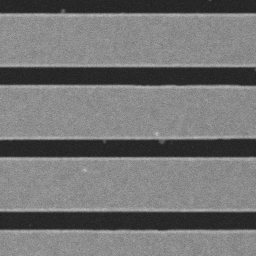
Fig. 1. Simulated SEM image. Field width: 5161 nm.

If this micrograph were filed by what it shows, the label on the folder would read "lines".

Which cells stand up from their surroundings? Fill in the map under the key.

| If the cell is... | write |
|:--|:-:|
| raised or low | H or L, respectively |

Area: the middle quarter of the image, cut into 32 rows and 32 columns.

HHHHHHHHHHHHHHHHHHHHHHHHHHHHHHHH
LLLLLLLLLLLLLLLLLLLLLLLLLLLLLLLL
LLLLLLLLLLLLLLLLLLLLLLLLLLLLLLLL
LLLLLLLLLLLLLLLLLLLLLLLLLLLLLLLL
LLLLLLLLLLLLLLLLLLLLLLLLLLLLLLLL
HHHHHHHHHHHHHHHHHHLLLLLLLHHHLLLH
HHHHHHHHHHHHHHHHHHHHHHHHHHHHHHHH
HHHHHHHHHHHHHHHHHHHHHHHHHHHHHHHH
HHHHHHHHHHHHHHHHHHHHHHHHHHHHHHHH
HHHHHHHHHHHHHHHHHHHHHHHHHHHHHHHH
HHHHHHHHHHHHHHHHHHHHHHHHHHHHHHHH
HHHHHHHHHHHHHHHHHHHHHHHHHHHHHHHH
HHHHHHHHHHHHHHHHHHHHHHHHHHHHHHHH
HHHHHHHHHHHHHHHHHHHHHHHHHHHHHHHH
HHHHHHHHHHHHHHHHHHHHHHHHHHHHHHHH
HHHHHHHHHHHHHHHHHHHHHHHHHHHHHHHH
HHHHHHHHHHHHHHHHHHHHHHHHHHHHHHHH
HHHHHHHHHHHHHHHHHHHHHHHHHHHHHHHH
HHHHHHHHHHHHHHHHHHHHHHHHHHHHHHHH
LLLLLLLLLLLLLLLLLLLLLLLLLLLLLLLL
LLLLLLLLLLLLLLLLLLLLLLLLLLLLLLLL
LLLLLLLLLLLLLLLLLLLLLLLLLLLLLLLL
LLLLLLLLLLLLLLLLLLLLLLLLLLLLLLLL
HHHHHHHHHHHHHHHHHHHHHHHHHHHHHHHH
HHHHHHHHHHHHHHHHHHHHHHHHHHHHHHHH
HHHHHHHHHHHHHHHHHHHHHHHHHHHHHHHH
HHHHHHHHHHHHHHHHHHHHHHHHHHHHHHHH
HHHHHHHHHHHHHHHHHHHHHHHHHHHHHHHH
HHHHHHHHHHHHHHHHHHHHHHHHHHHHHHHH
HHHHHHHHHHHHHHHHHHHHHHHHHHHHHHHH
HHHHHHHHHHHHHHHHHHHHHHHHHHHHHHHH
HHHHHHHHHHHHHHHHHHHHHHHHHHHHHHHH